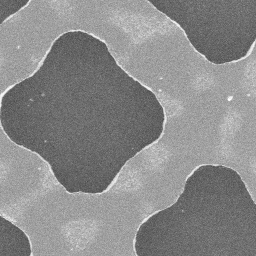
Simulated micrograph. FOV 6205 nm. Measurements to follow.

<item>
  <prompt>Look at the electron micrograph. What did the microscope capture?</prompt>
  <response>holes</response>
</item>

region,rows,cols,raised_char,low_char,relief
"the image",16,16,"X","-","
-XXXXXXXXX------
XXXXXXXXXXX-----
XXXX--XXXXXX----
XXX----XXXXXX--X
XX------XXXXXXXX
X--------XXXXXXX
----------XXXXXX
----------XXXXXX
----------XXXXXX
XX-------XXXXXXX
XXX-----XXXX--XX
XXXX---XXXXX---X
XXXXXXXXXXX-----
XXXXXXXXXX------
-XXXXXXXX-------
--XXXXXX--------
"